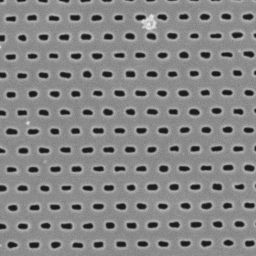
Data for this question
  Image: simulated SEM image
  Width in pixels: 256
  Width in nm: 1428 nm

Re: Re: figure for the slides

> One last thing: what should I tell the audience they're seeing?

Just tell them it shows a regular array of holes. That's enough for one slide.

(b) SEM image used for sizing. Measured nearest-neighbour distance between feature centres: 118 nanometers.